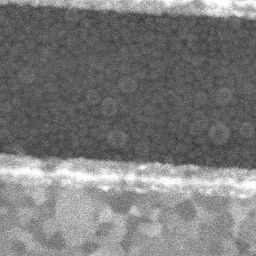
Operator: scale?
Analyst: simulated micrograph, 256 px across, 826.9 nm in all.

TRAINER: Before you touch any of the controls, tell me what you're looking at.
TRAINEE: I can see one or a few lines or trenches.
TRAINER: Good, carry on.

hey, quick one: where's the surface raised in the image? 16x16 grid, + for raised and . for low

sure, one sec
................
................
................
................
................
................
................
................
................
................
................
+++++++++++++++.
++++++++++++++++
++++++++++++++++
++++++++++++++++
++++++++++++++++